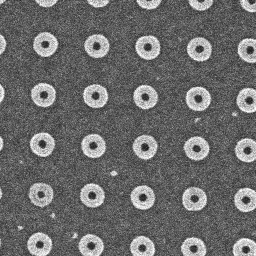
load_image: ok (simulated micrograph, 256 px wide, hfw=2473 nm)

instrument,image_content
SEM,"a regular array of ring-shaped raised bodies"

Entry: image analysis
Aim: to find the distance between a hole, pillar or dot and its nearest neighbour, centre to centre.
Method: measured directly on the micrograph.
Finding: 49.4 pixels